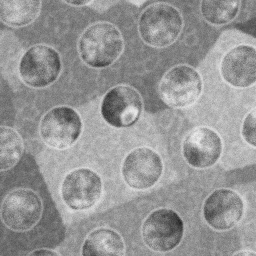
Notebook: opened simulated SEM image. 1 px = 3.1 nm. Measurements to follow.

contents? a regular array of holes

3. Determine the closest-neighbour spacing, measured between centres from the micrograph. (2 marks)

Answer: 198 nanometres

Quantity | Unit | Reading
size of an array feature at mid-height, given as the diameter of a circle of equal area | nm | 131